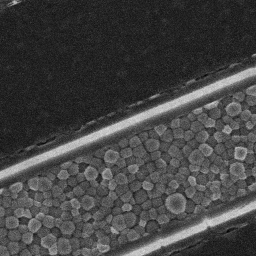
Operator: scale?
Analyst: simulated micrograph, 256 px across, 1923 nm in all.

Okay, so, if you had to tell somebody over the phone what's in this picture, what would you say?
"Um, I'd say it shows one or a few lines or trenches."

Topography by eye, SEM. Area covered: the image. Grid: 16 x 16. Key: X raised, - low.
----------------
----------------
----------------
----------------
----------------
-------------XXX
-----------XXXXX
--------XXXXXXXX
------XXXXXXXXXX
---XXXXXXXXXXXXX
-XXXXXXXXXXXXXXX
XXXXXXXXXXXXXXXX
XXXXXXXXXXXXXXXX
XXXXXXXXXXXXXX--
XXXXXXXXXXXX----
XXXXXXXXX-------